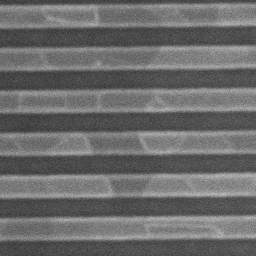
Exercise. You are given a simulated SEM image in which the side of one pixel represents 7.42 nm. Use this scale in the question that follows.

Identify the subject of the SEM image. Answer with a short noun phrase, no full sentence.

wiring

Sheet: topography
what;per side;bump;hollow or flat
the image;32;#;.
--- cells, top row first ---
................................
################################
################################
................................
................................
................................
################################
################################
############################....
................................
................................
################################
################################
################################
................................
................................
.............................###
################################
################################
................................
................................
................................
################################
################################
#####################...........
................................
................................
################################
################################
################################
................................
................................